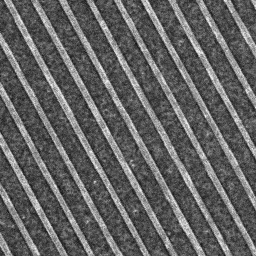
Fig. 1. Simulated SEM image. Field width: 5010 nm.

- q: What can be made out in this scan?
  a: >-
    parallel lines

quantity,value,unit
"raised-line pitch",472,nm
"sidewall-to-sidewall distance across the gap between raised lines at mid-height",378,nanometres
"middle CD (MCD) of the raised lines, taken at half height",98.8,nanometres